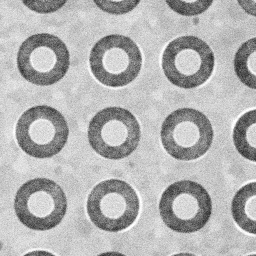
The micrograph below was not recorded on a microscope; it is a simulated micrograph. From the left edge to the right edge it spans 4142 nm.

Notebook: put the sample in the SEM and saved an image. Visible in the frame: an array of small figures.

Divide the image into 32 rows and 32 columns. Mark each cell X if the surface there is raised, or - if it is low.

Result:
XXX-----XXXX-----XXXX-----XXXX--
XXXX---XXXXXX---XXXXXX----XXXXX-
XXXXXXXXXXXXXXXXXXXXXXXXXXXXXXXX
XXXXXXXXXXXXXXXXXXXXXXXXXXXXXXXX
XXXX---XXXXXX---XXXXXXX-XXXXXXXX
XXX-----XXXX-----XXXX-----XXXX--
XX-------XX-------XX-------XXX--
XX-------XX-------XX-------XX---
XX-------XX-------XX-------XX---
XXX-----XXXX-----XXXX-----XXXX--
XXXX---XXXXXX---XXXXXX---XXXXX--
XXXXXXXXXXXXXXXXXXXXXXXXXXXXXXXX
XXXXXXXXXXXXXXXXXXXXXXXXXXXXXXXX
XXXX---XXXXXX--XXXXXXXX-XXXXXXXX
XXX-----XXXX-----XXXX-----XXXX--
XX------XXX------XXX------XXX---
XX-------XX-------XX-------XX---
XX------XXX-------XX-------XX---
XX------XXX------XXX------XXX---
XXXX---XXXXX----XXXXX----XXXXX--
XXXXXXXXXXXXXXXXXXXXXXXXXXXXXXXX
XXXXXXXXXXXXXXXXXXXXXXXXXXXXXXXX
XXXX--XXXXXXX--XXXXXXXXXXXXXXXXX
XX------XXXX-----XXXX-----XXXX--
XX------XXX------XXX------XXX---
XX------XXX-------XX-------XX---
XX------XXX------XXX------XXX---
XX------XXX------XXX------XXX---
XXXX---XXXXX----XXXXX----XXXXX--
XXXXXXXXXXXXXXXXXXXXXXXXXXXXXXXX
XXXXXXXXXXXXXXXXXXXXXXXXXXXXXXXX
XXX---XXXXXXX--XXXXXXXXXXXXXXXXX